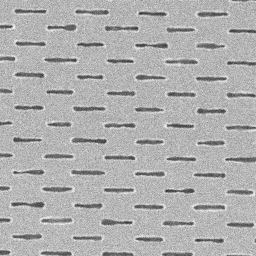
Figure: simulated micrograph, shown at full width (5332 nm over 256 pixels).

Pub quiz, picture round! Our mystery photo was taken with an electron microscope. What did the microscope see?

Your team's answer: a regular array of holes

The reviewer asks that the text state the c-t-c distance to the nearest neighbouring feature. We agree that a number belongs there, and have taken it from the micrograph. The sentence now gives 31.6 px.